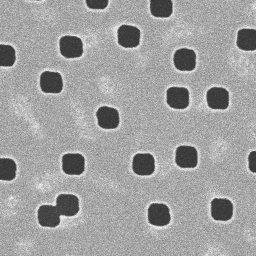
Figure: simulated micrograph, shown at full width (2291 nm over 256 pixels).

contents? a regular array of holes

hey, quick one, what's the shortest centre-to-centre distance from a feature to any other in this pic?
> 388 nanometres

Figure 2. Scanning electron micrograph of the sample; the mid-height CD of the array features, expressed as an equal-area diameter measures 24.2 px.